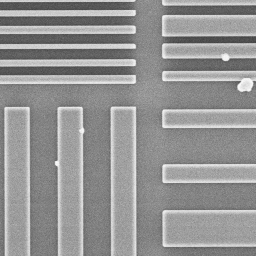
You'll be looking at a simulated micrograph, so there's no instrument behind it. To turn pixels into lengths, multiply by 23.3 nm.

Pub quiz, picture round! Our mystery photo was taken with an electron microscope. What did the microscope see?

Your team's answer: groups of lines, slits or small figures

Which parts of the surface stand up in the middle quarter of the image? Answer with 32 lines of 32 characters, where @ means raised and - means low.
@@@@@@@@@@@@@@------------------
--------------------------------
-------------------------@@@@@@@
@@@@@@@@@@@@@@@@@@-------@@@@@@@
@@@@@@@@@@@@@@@@@@--------------
--------------------------------
--------------------------------
--------------------------------
--------------------------------
--------------------------------
--------------------------------
@@@@@-------@@@@@@--------------
@@@@@-------@@@@@@-------@@@@@@@
@@@@@-------@@@@@@-------@@@@@@@
@@@@@-------@@@@@@-------@@@@@@@
@@@@@-------@@@@@@-------@@@@@@@
@@@@@-------@@@@@@--------------
@@@@@-------@@@@@@--------------
@@@@@-------@@@@@@--------------
@@@@@-------@@@@@@--------------
@@@@@-------@@@@@@--------------
@@@@@-------@@@@@@--------------
@@@@@-------@@@@@@--------------
@@@@@-------@@@@@@--------------
@@@@@-------@@@@@@--------------
@@@@@-------@@@@@@-------@@@@@@@
@@@@@-------@@@@@@-------@@@@@@@
@@@@@-------@@@@@@-------@@@@@@@
@@@@@-------@@@@@@-------@@@@@@@
@@@@@-------@@@@@@-------@@@@@@@
@@@@@-------@@@@@@--------------
@@@@@-------@@@@@@--------------